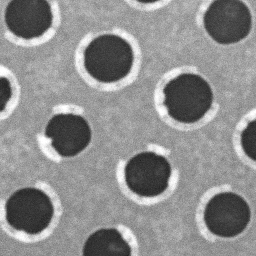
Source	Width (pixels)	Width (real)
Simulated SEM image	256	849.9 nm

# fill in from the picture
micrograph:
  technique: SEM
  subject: holes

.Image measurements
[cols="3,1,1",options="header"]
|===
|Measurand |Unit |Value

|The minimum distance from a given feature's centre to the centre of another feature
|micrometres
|0.286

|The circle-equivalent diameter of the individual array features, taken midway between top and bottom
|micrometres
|0.16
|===